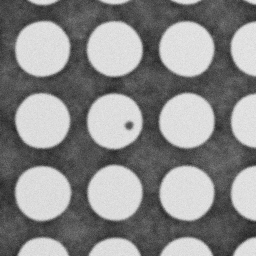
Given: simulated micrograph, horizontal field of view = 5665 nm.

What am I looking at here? an array of small figures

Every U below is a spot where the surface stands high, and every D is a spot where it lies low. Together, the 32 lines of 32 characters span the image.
DDDDDDDDDDDDDDDDDDDDDDDDDDDDDDDD
DDDDDDDDDDDDDDDDDDDDDDDDDDDDDDDD
DDDDDDDDDDDDDDDDDDDDDDDDDDDDDDDD
DDDUUUUDDDDDUUUUDDDDDUUUUDDDDDUU
DDUUUUUUDDDUUUUUUDDDUUUUUUDDDUUU
DDUUUUUUUDDUUUUUUUDDUUUUUUUDDUUU
DDUUUUUUUDDUUUUUUUDDUUUUUUUDDUUU
DDUUUUUUDDDUUUUUUUDDUUUUUUDDDUUU
DDDUUUUUDDDDUUUUUDDDDUUUUUDDDDUU
DDDDDUDDDDDDDDUDDDDDDDDUDDDDDDDD
DDDDDDDDDDDDDDDDDDDDDDDDDDDDDDDD
DDDDDDDDDDDDDDDDDDDDDDDDDDDDDDDD
DDDUUUUDDDDDUUUUDDDDDUUUUUDDDDUU
DDUUUUUUDDDUUUUUUDDDUUUUUUDDDUUU
DDUUUUUUUDDUUUUUUUDDUUUUUUUDDUUU
DDUUUUUUUDDUUUUUUUDDUUUUUUUDDUUU
DDUUUUUUDDDUUUUUUDDDUUUUUUDDDUUU
DDDUUUUUDDDDUUUUUDDDDUUUUUDDDDUU
DDDDDDDDDDDDDDUDDDDDDDDDDDDDDDDD
DDDDDDDDDDDDDDDDDDDDDDDDDDDDDDDD
DDDDDDDDDDDDDDDDDDDDDDDDDDDDDDDD
DDDUUUUDDDDDUUUUDDDDDUUUUDDDDDUU
DDUUUUUUDDDUUUUUUDDDUUUUUUDDDUUU
DDUUUUUUUDDUUUUUUUDDUUUUUUUDDUUU
DDUUUUUUUDDUUUUUUUDDUUUUUUUDDUUU
DDUUUUUUUDDUUUUUUDDDUUUUUUDDDUUU
DDDUUUUUDDDDUUUUUDDDDUUUUUDDDDUU
DDDDDUDDDDDDDDDDDDDDDDDDDDDDDDDD
DDDDDDDDDDDDDDDDDDDDDDDDDDDDDDDD
DDDDDDDDDDDDDDDDDDDDDDDDDDDDDDDD
DDDUUUUUDDDDUUUUUDDDDUUUUUDDDDUU
DDUUUUUUDDDUUUUUUDDDUUUUUUDDDUUU